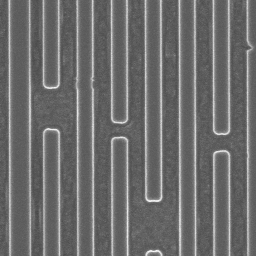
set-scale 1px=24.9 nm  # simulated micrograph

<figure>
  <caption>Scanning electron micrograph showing parallel lines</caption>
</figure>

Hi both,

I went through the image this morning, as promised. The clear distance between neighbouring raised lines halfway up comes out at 464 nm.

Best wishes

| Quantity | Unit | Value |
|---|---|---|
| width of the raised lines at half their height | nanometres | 396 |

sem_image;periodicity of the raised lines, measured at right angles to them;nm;837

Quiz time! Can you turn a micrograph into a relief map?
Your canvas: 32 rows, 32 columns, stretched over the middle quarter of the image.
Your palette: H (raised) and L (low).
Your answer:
LLLLHHHLLLLLHHHHLLLLLHHHLLLLLHHH
LLLLHHHLLLLLHHHHLLLLLHHHLLLLLHHH
LLLLHHHLLLLLHHHHLLLLLHHHLLLLLHHH
LLLHHHHLLLLLHHHHLLLLLHHHLLLLLHHH
LLLHHHHLLLLLHHHHLLLLLHHHLLLLLHHH
LLLHHHHLLLLLHHHHLLLLLHHHLLLLLHHH
LLLLHHHLLLLLHHHHLLLLLHHHLLLLLHHH
LLLLHHHLLLLLHHHHLLLLLHHHLLLLLHHH
LLLLHHHLLLLLHHHHLLLLLHHHLLLLLHHH
LLLLHHHLLLLLHHHHLLLLLHHHLLLLLHHH
LLLLHHHLLLLLHHHHLLLLHHHHLLLLLHHH
LLLLHHHLLLLLHHHHLLLLHHHHLLLLLHHH
LLLLHHHLLLLLHHHHLLLLLHHHLLLLLHHH
LLLLHHHLLLLLHHHHLLLLLHHHLLLLLHHH
LLLLHHHLLLLLHHHLLLLLLHHHLLLLLHHH
LLLLHHHLLLLLLLLLLLLLLHHHLLLLLHHH
LLLLHHHLLLLLLLLLLLLLLHHHLLLLLHHH
LLLLHHHLLLLLLLLLLLLLHHHHLLLLLHHH
LLLLHHHLLLLLLHHLLLLLHHHHLLLLLHHH
LLLLHHHLLLLLHHHHLLLLLHHHLLLLLHHH
LLLLHHHLLLLLHHHHLLLLLHHHLLLLLHHH
LLLLHHHLLLLLHHHHLLLLLHHHLLLLLHHH
LLLLHHHLLLLLHHHHLLLLLHHHLLLLLHHH
LLLHHHHLLLLLHHHHLLLLLHHHLLLLLHHH
LLLLHHHLLLLLHHHHLLLLLHHHLLLLLHHH
LLLHHHHLLLLLHHHHLLLLLHHHLLLLLHHH
LLLHHHHLLLLLHHHHLLLLLHHHLLLLLHHH
LLLHHHHLLLLLHHHHLLLLLHHHLLLLLHHH
LLLLHHHLLLLLHHHHLLLLLHHHLLLLLHHH
LLLLHHHLLLLLHHHHLLLLLHHHLLLLLHHH
LLLLHHHLLLLLHHHHLLLLLHHHLLLLLHHH
LLLLHHHLLLLLHHHHLLLLLHHHLLLLLHHH